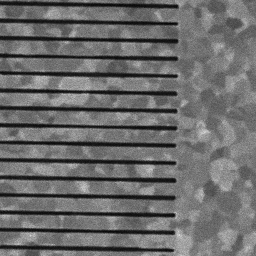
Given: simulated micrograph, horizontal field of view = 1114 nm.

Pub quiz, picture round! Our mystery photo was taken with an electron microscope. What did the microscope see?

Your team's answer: parallel lines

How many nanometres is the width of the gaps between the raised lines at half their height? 20.1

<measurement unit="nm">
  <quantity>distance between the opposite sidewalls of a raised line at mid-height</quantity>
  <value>56.6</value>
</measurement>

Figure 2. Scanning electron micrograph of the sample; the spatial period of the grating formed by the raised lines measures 75.8 nm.